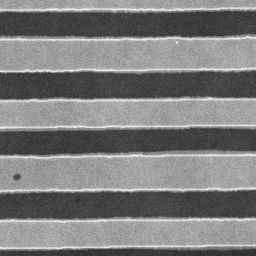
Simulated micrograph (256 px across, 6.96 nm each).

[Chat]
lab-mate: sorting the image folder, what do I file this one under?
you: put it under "lines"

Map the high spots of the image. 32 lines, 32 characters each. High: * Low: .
********************************
................................
................................
................................
................................
********************************
********************************
********************************
********************************
................................
................................
................................
.......*............************
********************************
********************************
********************************
................................
................................
................................
...........*********************
********************************
********************************
********************************
********************************
................................
................................
................................
..............***......*********
********************************
********************************
********************************
................................